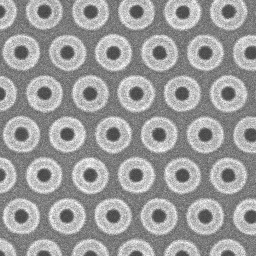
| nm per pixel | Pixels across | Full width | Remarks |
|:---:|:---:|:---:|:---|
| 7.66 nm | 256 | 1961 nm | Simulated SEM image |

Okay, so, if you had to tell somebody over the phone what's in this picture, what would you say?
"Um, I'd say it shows a regular array of ring-shaped raised bodies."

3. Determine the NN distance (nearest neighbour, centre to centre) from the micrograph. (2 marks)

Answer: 351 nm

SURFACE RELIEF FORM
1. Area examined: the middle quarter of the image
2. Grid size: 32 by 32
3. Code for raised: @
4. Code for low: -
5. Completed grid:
@@@@------@@@@@------@@@@@@-----
-----------@@@---------@@-------
--------------------------------
-----@@@@-------@@@@--------@@@-
---@@@@@@@----@@@@@@@-----@@@@@@
--@@@@-@@@----@@@@@@@@----@@@@@@
--@@@---@@@---@@@---@@---@@@---@
--@@@---@@@---@@----@@---@@@---@
--@@@---@@@---@@@--@@@---@@@---@
---@@@@@@@----@@@@@@@@----@@@@@@
---@@@@@@@-----@@@@@@------@@@@@
-----@@@---------@@@--------@@@-
--------------------------------
@@------------------------------
@@@@-----@@@@@@------@@@@@@-----
@@@@@----@@@@@@@----@@@@@@@@---@
--@@@---@@@---@@----@@---@@@---@
---@@---@@----@@@--@@@----@@---@
--@@@---@@@---@@@--@@@----@@---@
@@@@@----@@@@@@@----@@@-@@@@---@
@@@@-----@@@@@@@-----@@@@@@-----
@@--------@@@@--------@@@@------
--------------------------------
--------------------------------
----@@@@@------@@@@@@------@@@@@
---@@@@@@@----@@@@@@@@----@@@@@@
--@@@---@@@---@@@--@@@---@@@@--@
--@@@---@@@---@@----@@---@@@---@
--@@@---@@@---@@----@@----@@---@
---@@@-@@@@---@@@@-@@@----@@@-@@
---@@@@@@@-----@@@@@@@----@@@@@@
----@@@@@-------@@@@@------@@@@@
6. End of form